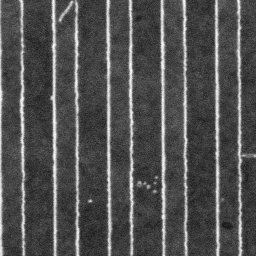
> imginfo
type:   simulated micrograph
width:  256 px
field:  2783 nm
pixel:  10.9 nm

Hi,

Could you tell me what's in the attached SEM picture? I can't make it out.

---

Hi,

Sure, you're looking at lines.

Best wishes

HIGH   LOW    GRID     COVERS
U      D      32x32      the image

UUUDDDDUUUDDDDUUDDDDUUUDDDDUUUDD
UUUDDDDUUUDDDUUUDDDDUUUDDDDUUUDD
UUUDDDDUUUDDDDUUDDDDUUUDDDDUUUDD
UUUDDDDUUUDDDDUUDDDDUUUDDDDUUUDD
UUUDDDDUUUDDDDUUDDDDUUUDDDDUUUDD
UUUDDDDUUUDDDDUUDDDDUUUDDDDUUUDD
UUUDDDDUUUDDDDUUDDDDUUUDDDDUUUDD
UUUDDDDUUDDDDDUUDDDDUUUDDDDUUUDD
UUUDDDDUUUDDDDUUDDDDUUUDDDDUUUDD
UUUDDDDUUDDDDDUUDDDDUUUDDDDUUUDD
UUUDDDDUUUDDDDUUDDDDUUUDDDDUUUDD
UUUDDDDUUUDDDDUUDDDDUUUDDDDUUUDD
UUUDDDDUUUDDDDUUDDDDUUUDDDDUUUDD
UUUDDDDUUUDDDDUUDDDDUUUDDDDUUUDD
UUUDDDDUUUDDDDUUDDDDUUUDDDDUUUDD
UUUDDDDUUUDDDDUUDDDDUUUDDDDUUUDD
UUUDDDDUUUDDDDUUDDDDUUUDDDDUUUDD
UUUDDDDUUUDDDDUUDDDDUUUDDDDUUUDD
UUUDDDDUUUDDDDUUDDDDUUUDDDDUUUDD
UUUDDDDUUUDDDDUUDDDDUUUDDDDUUUDD
UUUDDDDUUUDDDDUUDDDDUUUDDDDUUUDD
UUUDDDDUUUDDDDUUDDDDUUUDDDDUUUDD
UUUDDDDUUUDDDDUUDDDDUUUDDDDUUUDD
UUUDDDDUUUDDDDUUDDDDUUUDDDDUUUDD
UUUDDDDUUUDDDDUUDDDDUUUDDDDUUUDD
UUUDDDDUUUDDDDUUDDDDUUUDDDDUUUDD
UUUDDDDUUUDDDDUUDDDDUUUDDDDUUUDD
UUUDDDDUUUDDDDUUDDDDUUUDDDDUUUDD
UUUDDDDUUUDDDDUUDDDDUUUDDDDUUUDD
UUUDDDDUUUDDDDUUDDDDUUUDDDDUUUDD
UUUDDDDUUUDDDDUUDDDDUUUDDDDUUUDD
UUUDDDDUUUDDDDUUDDDDUUUDDDDUUUDD